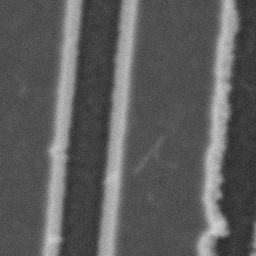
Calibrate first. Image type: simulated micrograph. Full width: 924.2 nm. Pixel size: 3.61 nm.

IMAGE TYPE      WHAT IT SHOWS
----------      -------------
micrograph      one or a few lines or trenches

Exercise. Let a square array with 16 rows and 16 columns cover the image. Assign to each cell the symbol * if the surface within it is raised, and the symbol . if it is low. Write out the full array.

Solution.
*****...******..
*****...******..
****....******..
****....******..
****....******..
****....******..
****...*******..
****...*******..
****...*******..
****...*******..
****...*******..
****...******...
****...******...
***....*******..
***....*******..
***....******...